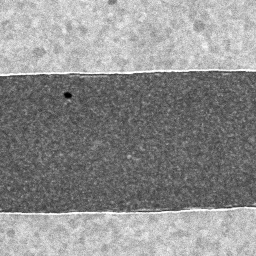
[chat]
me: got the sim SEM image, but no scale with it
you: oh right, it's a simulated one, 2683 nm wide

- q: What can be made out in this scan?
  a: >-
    one or a few lines or trenches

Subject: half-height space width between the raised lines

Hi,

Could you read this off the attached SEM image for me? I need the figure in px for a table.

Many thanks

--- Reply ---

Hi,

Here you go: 137